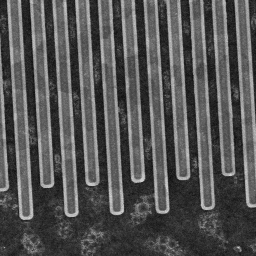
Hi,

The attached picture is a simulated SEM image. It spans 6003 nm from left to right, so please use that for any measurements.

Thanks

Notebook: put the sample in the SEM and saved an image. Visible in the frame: parallel lines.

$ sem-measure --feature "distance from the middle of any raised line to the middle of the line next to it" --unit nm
533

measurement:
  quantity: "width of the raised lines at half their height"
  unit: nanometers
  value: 260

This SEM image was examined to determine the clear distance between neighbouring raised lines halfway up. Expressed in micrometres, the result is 0.263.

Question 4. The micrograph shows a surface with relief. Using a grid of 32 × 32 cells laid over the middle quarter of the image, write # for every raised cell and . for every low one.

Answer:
#...###...###...##...###...###..
#...###...###...##...###...###..
#...###...###...##...###...###..
#...###...###...##....##...###..
#...###...###...##....##...###..
#...###...###...##....##...###..
#...###...###...##....##...###..
##...##...###...###...##...###..
##...##...###...###...##...###..
##...##...###...###...##....##..
##...##....##...###...###...##..
##...##....##...###...###...##..
##...##....##...###...###...##..
##...##....##...###...###...##..
##...###...##...###...###...##..
##...###...##...###...###...##..
##...###...##...###...###...##..
##...###...###...##...###...###.
##...###...###...##...###...###.
##...###...###...##...###...###.
##...###...###...##....##...###.
##...###...###...##....##...###.
##...###...###...##....##...###.
##...###...###...##....##...###.
###...##...###...###...##...###.
###...##...###...###...##...###.
###...##...###...###...##...###.
###...##....##...###...###...##.
###...##....##...###...###...##.
###...##....##.........###......
###.........##.........###......
###.........##.........###......